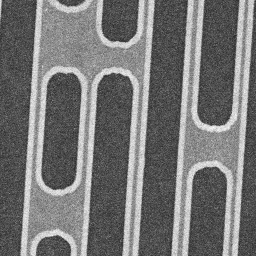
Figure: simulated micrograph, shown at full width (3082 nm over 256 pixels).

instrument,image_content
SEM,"parallel lines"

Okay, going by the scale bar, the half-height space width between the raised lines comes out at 482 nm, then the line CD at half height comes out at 126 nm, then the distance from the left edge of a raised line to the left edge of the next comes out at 0.601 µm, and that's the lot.